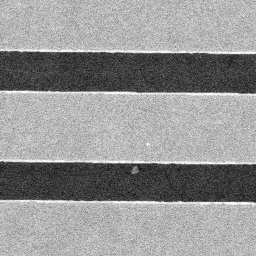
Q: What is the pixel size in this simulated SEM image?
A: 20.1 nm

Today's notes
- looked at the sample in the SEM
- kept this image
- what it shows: lines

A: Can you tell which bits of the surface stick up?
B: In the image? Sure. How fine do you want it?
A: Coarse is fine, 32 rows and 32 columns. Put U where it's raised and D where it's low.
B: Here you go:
UUUUUUUUUUUUUUUUUUUUUUUUUUUUUUUU
UUUUUUUUUUUUUUUUUUUUUUUUUUUUUUUU
UUUUUUUUUUUUUUUUUUUUUUUUUUUUUUUU
UUUUUUUUUUUUUUUUUUUUUUUUUUUUUUUU
UUUUUUUUUUUUUUUUUUUUUUUUUUUUUUUU
UUUUUUUUUUUUUUUUUUUUUUUUUUUUUUUU
DDDDDDDDDDDDDUUUUUUUUUUUUUUUUUUU
DDDDDDDDDDDDDDDDDDDDDDDDDDDDDDDD
DDDDDDDDDDDDDDDDDDDDDDDDDDDDDDDD
DDDDDDDDDDDDDDDDDDDDDDDDDDDDDDDD
DDDDDDDDDDDDDDDDDDDDDDDDDDDDDDDD
UUUUDDDDDDDDDDDDDDDDDDDDDDDDDDDD
UUUUUUUUUUUUUUUUUUUUUUUUUUUUUUUU
UUUUUUUUUUUUUUUUUUUUUUUUUUUUUUUU
UUUUUUUUUUUUUUUUUUUUUUUUUUUUUUUU
UUUUUUUUUUUUUUUUUUUUUUUUUUUUUUUU
UUUUUUUUUUUUUUUUUUUUUUUUUUUUUUUU
UUUUUUUUUUUUUUUUUUUUUUUUUUUUUUUU
UUUUUUUUUUUUUUUUUUUUUUUUUUUUUUUU
UUUUUUUUUUUUUUUUUUUUUUUUUUUUUUUU
DDDDDDDDDDDDDDDDDDDDDDDDDDDDDDDD
DDDDDDDDDDDDDDDDDDDDDDDDDDDDDDDD
DDDDDDDDDDDDDDDDDDDDDDDDDDDDDDDD
DDDDDDDDDDDDDDDDDDDDDDDDDDDDDDDD
DDDDDDDDDDDDDDDDDDDDDDDDDDDDDDDD
UUUUUUUUUUUUUUUUUUUUUUUUUUUUUUUU
UUUUUUUUUUUUUUUUUUUUUUUUUUUUUUUU
UUUUUUUUUUUUUUUUUUUUUUUUUUUUUUUU
UUUUUUUUUUUUUUUUUUUUUUUUUUUUUUUU
UUUUUUUUUUUUUUUUUUUUUUUUUUUUUUUU
UUUUUUUUUUUUUUUUUUUUUUUUUUUUUUUU
UUUUUUUUUUUUUUUUUUUUUUUUUUUUUUUU